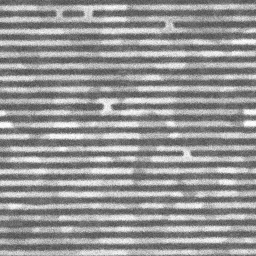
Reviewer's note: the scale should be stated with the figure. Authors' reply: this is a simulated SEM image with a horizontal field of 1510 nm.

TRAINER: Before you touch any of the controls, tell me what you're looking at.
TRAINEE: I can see parallel lines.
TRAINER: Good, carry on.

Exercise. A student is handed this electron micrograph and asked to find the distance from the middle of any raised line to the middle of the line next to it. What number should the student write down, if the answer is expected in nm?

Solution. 68.8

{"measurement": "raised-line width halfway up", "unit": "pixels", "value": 3.88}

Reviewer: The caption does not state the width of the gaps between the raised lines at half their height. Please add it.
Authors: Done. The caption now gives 0.0457 microns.